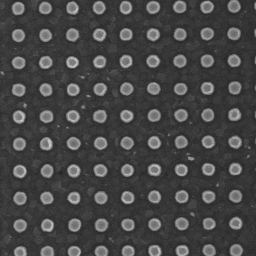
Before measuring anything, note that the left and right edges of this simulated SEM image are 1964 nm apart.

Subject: a regular array of raised bodies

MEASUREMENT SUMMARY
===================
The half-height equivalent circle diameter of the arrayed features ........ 0.0936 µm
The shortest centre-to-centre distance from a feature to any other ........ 205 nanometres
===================